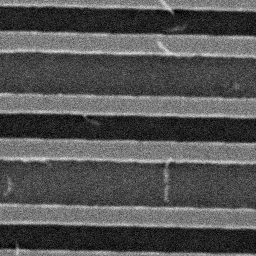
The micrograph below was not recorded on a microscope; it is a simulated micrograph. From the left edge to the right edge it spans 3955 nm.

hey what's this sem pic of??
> lines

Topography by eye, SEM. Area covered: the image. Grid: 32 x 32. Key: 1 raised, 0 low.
11111111111111111111111111111111
00000000000000000000000000000000
00000000000000000000000000000000
00000000000000000000000000000000
11111111111111111111111111100000
11111111111111111111111111111111
11000111111111111111111111111111
00000000000000000000000000000000
00000000000000000000000000000000
00000000000000000000000000000000
00000000000000000000000000000000
00000000000000000000000000000000
11111111111111111111111111111111
11111111111111111111111111111111
00000000000000000000001111111111
00000000000000000000000000000000
00000000000000000000000000000000
11111100000000000000000000000000
11111111111111111111111111111111
11111111111111111111111111111111
00000000000000000000000000000000
00000000000000000000000000000000
00000000000000000000000000000000
00000000000000000000000000000000
00000000000000000000000000000000
00000000000000000000000000000000
11111111111111111111111111111111
11111111111111111111111111111111
00000000000000000000000000001111
00000000000000000000000000000000
00000000000000000000000000000000
11111111111111000000000000000000